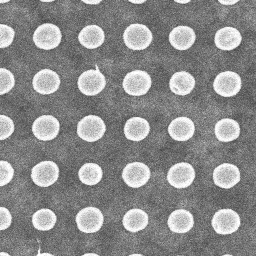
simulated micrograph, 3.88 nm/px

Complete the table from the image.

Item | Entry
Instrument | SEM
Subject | a regular array of raised bodies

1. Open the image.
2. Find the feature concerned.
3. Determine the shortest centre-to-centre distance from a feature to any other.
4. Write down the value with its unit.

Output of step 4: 0.176 µm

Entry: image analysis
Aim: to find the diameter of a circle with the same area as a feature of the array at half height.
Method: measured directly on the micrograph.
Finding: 98.1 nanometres